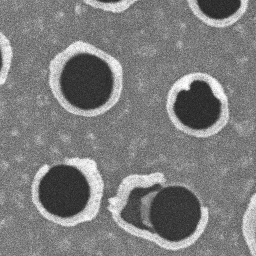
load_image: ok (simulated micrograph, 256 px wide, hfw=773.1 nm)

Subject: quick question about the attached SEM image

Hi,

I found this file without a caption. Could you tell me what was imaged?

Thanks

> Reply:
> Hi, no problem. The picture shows holes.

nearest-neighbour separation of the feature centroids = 0.323 micrometres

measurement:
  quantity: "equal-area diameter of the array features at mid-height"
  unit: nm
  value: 161